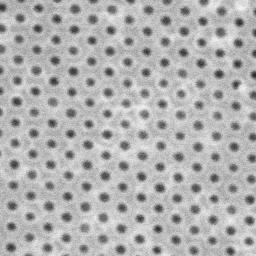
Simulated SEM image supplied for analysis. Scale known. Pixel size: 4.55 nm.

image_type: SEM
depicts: a regular array of holes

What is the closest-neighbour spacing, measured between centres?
93.7 nm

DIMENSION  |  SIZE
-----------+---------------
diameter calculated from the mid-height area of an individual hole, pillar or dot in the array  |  46.9 nm